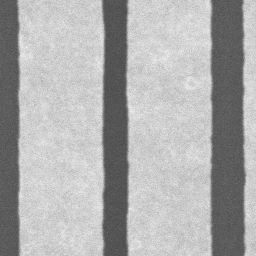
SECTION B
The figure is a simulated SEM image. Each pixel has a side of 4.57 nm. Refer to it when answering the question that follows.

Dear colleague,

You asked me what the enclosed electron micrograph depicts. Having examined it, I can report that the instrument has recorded lines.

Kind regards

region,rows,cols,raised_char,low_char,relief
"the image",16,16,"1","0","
0111110011111001
0111110011111001
0111110011111001
0111110011111001
0111110011111001
0111110011111001
0111110011111001
0111110011111001
0111110011111001
0111110011111001
0111110011111001
0111110011111001
0111110011111001
0111110011111001
0111110011111001
0111110011111001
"